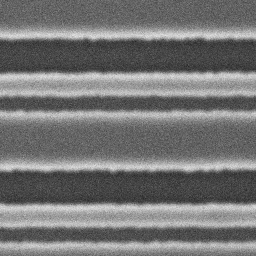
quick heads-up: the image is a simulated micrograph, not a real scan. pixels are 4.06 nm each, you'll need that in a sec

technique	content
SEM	lines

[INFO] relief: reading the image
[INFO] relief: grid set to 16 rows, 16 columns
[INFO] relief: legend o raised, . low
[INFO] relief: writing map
oooooooooooooooo
oooooooooooooooo
................
................
................
oooooooooooooooo
oooooooooooooooo
oooooooooooooooo
oooooooooooooooo
oooooooooooooooo
oooooooooooooooo
................
................
oooooooooooooooo
oooooooooooooooo
oooooooooooooooo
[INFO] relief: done